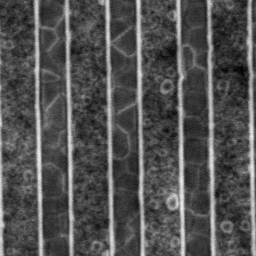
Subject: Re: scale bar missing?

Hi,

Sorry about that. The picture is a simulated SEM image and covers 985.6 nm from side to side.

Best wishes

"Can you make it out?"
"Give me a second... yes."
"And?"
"one or a few lines or trenches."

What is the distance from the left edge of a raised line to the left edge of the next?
273 nanometers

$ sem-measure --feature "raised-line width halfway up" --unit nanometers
156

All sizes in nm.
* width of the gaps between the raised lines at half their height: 116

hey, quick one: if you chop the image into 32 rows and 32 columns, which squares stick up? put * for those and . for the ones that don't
*****...*****....*****....*****.
*****...*****....*****....*****.
*****...*****....*****....*****.
*****...*****....*****....*****.
*****...*****....*****....*****.
*****...******...*****....*****.
*****...******...*****....*****.
*****...******...*****....*****.
*****...******...******...*****.
*****...******...******...*****.
*****....*****...******...*****.
*****....*****...*****....*****.
*****....*****...******...*****.
*****....*****...******...*****.
*****....*****...******...*****.
*****....*****...******...*****.
*****....*****...******...*****.
*****....*****....*****...*****.
*****....*****....*****...*****.
*****....*****....*****...*****.
*****....*****....*****...*****.
*****....*****....*****...******
*****....*****....*****...******
*****....*****....*****...******
*****....*****....*****...******
*****....*****....*****...******
*****....*****....*****....*****
*****....*****....*****....*****
*****....*****....*****....*****
*****....*****....*****....*****
*****....*****....*****....*****
*****....*****....*****....*****